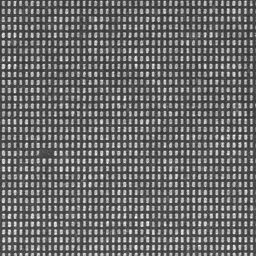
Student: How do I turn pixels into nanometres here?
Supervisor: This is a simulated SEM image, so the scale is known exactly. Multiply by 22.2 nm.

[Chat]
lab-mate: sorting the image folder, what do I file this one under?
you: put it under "a regular array of raised bodies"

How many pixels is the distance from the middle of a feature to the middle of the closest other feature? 5.56